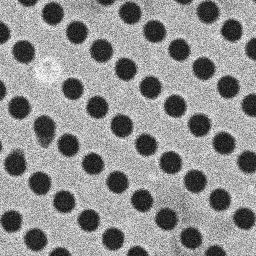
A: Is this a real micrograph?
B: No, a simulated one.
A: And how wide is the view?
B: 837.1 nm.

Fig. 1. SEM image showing a regular array of holes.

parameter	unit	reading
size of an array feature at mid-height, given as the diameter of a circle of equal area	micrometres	0.075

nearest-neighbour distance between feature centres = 0.0999 microns